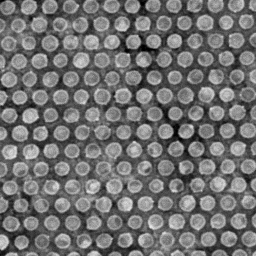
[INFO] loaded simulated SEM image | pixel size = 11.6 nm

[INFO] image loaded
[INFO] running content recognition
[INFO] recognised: a regular array of raised bodies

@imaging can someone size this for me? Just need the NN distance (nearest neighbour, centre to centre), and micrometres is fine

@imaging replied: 0.236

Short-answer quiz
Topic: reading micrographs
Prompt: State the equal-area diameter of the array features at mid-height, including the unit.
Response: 0.161 micrometres